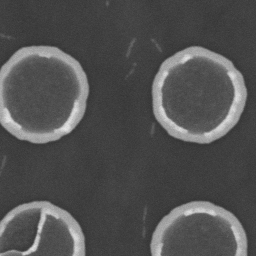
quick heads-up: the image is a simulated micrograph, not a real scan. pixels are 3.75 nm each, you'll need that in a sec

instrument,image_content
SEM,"raised bodies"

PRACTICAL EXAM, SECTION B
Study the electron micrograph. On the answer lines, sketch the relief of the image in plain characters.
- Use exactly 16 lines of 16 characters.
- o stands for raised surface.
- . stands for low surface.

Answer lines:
................
................
................
.ooo.......oo...
ooooo.....ooooo.
ooooo.....ooooo.
ooooo.....ooooo.
ooooo.....ooooo.
..o........oo...
................
................
................
................
.ooo.......ooo..
ooooo.....ooooo.
ooooo.....ooooo.